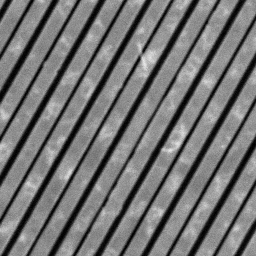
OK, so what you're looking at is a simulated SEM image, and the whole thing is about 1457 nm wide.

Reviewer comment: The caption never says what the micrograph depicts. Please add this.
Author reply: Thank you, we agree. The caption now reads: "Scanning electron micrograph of parallel lines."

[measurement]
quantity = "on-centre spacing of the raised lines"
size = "116 nm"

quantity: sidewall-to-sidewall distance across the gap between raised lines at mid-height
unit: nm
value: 40.3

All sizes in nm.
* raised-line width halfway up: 82.3